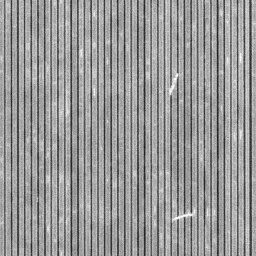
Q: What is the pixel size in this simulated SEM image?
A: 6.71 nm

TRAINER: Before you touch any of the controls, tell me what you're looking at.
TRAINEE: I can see parallel lines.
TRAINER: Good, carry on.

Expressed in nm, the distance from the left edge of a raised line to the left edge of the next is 44.6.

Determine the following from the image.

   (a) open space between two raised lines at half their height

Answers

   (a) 17.6 nm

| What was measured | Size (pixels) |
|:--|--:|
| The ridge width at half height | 4.38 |